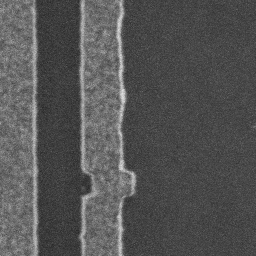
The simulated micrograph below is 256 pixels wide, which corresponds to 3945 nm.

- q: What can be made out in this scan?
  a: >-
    one or a few lines or trenches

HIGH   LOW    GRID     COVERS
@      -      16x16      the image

@@---@@@--------
@@---@@---------
@@---@@---------
@@---@@@--------
@@---@@@--------
@@---@@@--------
@@---@@@--------
@@---@@@--------
@@---@@@--------
@@---@@@--------
@@---@@@--------
@@----@@--------
@@---@@@--------
@@---@@@--------
@@---@@@--------
@@---@@@--------